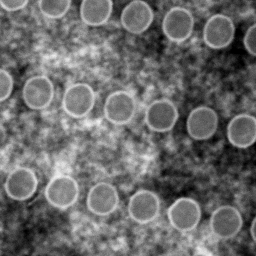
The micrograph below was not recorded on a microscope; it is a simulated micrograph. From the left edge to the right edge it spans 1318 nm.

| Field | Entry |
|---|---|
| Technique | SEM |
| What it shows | a regular array of raised bodies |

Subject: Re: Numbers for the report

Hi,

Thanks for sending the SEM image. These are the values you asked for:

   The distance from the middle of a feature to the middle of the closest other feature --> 212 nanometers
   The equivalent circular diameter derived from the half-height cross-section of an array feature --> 164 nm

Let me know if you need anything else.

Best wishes